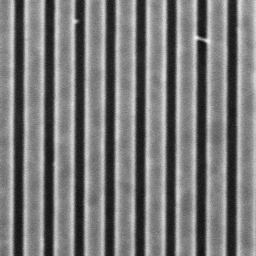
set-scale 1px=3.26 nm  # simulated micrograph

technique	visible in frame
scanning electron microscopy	parallel lines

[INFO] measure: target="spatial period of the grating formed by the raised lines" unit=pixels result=30.4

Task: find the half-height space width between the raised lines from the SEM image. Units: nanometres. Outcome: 41.1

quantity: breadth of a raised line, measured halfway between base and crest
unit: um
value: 0.059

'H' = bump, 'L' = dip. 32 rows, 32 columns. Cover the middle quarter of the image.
HHLLLLHHHHLLLHHHHHLLLHHHHLLLHHHH
HHLLLLHHHHLLLHHHHHLLLHHHHLLLHHHH
HHLLLLHHHHLLLHHHHHLLLHHHHLLLHHHH
HHLLLLHHHHLLLHHHHHLLLHHHHLLLHHHH
HHLLLLHHHHLLLHHHHHLLLHHHHLLLHHHH
HHLLLLHHHHLLLHHHHHLLLHHHHLLLHHHH
HHLLLLHHHHLLLHHHHHLLLHHHHLLLHHHH
HHLLLLHHHHLLLHHHHHLLLHHHHLLLHHHH
HHLLLLHHHHLLLHHHHHLLLHHHHLLLHHHH
HHLLLLHHHHLLLHHHHHLLLHHHHLLLHHHH
HHLLLLHHHHLLLHHHHHLLLHHHHLLLHHHH
HHLLLLHHHHLLLHHHHHLLLHHHHLLLHHHH
HHLLLLHHHHLLLHHHHHLLLHHHHLLLHHHH
HHLLLLHHHHLLLHHHHHLLLHHHHLLLHHHH
HHLLLLHHHHLLLHHHHHLLLHHHHLLLHHHH
HHLLLLHHHHLLLHHHHHLLLHHHHLLLHHHH
HHLLLLHHHHLLLHHHHLLLLHHHHLLLHHHH
HHLLLLHHHHLLLHHHHLLLLHHHHLLLHHHH
HHLLLLHHHHLLLHHHHLLLLHHHHLLLHHHH
HHLLLLHHHHLLLHHHHLLLLHHHHLLLHHHH
HHLLLLHHHHLLLHHHHLLLLHHHHLLLHHHH
HHLLLLHHHHLLLHHHHLLLLHHHHLLLHHHH
HHLLLLHHHHLLLHHHHLLLLHHHHLLLHHHH
HHLLLHHHHHLLLHHHHLLLLHHHHLLLHHHH
HHLLLHHHHHLLLHHHHLLLLHHHHLLLHHHH
HHLLLHHHHHLLLHHHHLLLLHHHHLLLHHHH
HHLLLHHHHHLLLHHHHLLLLHHHHLLLHHHH
HHLLLHHHHHLLLHHHHLLLLHHHHLLLHHHH
HHLLLHHHHHLLLHHHHLLLLHHHHLLLHHHH
HHLLLHHHHHLLLHHHHLLLLHHHHLLLHHHH
HHLLLHHHHHLLLHHHHLLLLHHHHLLLHHHH
HHLLLHHHHHLLLHHHHLLLLHHHHLLLHHHH